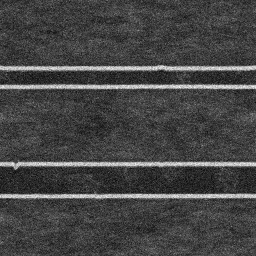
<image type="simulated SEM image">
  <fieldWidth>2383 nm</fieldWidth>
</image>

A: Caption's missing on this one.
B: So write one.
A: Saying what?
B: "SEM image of one or a few lines or trenches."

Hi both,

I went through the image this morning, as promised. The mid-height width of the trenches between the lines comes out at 713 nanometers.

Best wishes